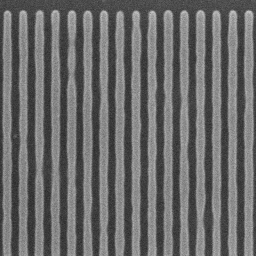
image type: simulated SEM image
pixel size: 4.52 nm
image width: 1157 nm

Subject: groups of lines, slits or small figures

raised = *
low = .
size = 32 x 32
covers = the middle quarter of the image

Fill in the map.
.**..**..**..**..**..**..**..**.
.*...**..**..**..**..**..**..**.
.....**..**..**..**..**..**..**.
.*...**..**..**..**..**..**..**.
.**..**..**..**..**..**..**..**.
.**..**..**..**..**..**..**..**.
.**..**..**..**..**..**..**..**.
.**..**...*..**..**..**..**..**.
.**..**...*..**..**..**...*..**.
.**..**...*..**..**..**..**..**.
.**..**..**..**..**..**..**..**.
.**..**..**..**..**..**..**..**.
.**..**..**..**..**..**..**..**.
.**..**..**..**..**..**..**..**.
.**..**..**..**..**..**..**..**.
.**..**..**..**..**..**..**..**.
.**..**..**..**..**..**..**..**.
.**..**..**..**..**..**..**..**.
.**..**..**..**..**..**..**..**.
.**..**..**..**..**..**..**..**.
.**..**..**..**..**..**..**..**.
.**..**..**..**..**..**..**..**.
.**..**..**..**..**..**..**..**.
.**..**..**..**..**..**..**..**.
.**..**..**..**..**..**..**..**.
.**..**..**..**..**..**..**..**.
.**..**..**..**..**..**..**..**.
.**..**..**..**..**..**..**..**.
.**..**..**..**..**..**..**..**.
.**..**..**..**..**..**..**..**.
.**..**..**..**..**..**..**..**.
.**..**..**..**..**..**..**..**.